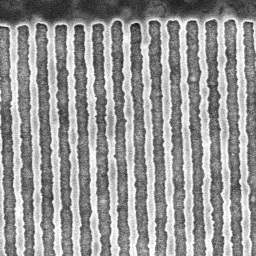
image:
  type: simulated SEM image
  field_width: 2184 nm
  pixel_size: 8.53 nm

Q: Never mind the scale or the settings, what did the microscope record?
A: parallel lines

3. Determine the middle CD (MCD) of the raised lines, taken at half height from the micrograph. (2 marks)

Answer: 57.6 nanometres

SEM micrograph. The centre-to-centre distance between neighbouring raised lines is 161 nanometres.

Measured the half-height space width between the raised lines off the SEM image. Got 11.7 px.